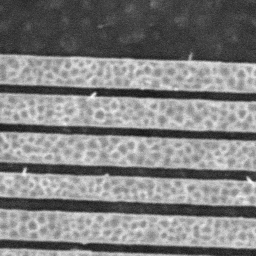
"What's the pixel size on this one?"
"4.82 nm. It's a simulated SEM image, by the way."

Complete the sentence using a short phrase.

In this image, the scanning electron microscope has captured parallel lines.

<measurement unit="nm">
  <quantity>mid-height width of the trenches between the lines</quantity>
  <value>50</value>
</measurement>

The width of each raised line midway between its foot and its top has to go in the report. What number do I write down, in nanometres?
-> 137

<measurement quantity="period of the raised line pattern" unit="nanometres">187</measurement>